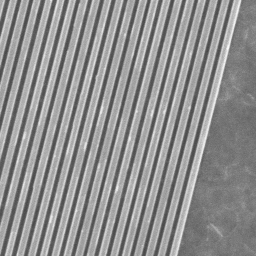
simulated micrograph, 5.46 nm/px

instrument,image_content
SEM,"parallel lines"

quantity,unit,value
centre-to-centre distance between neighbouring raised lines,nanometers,62.5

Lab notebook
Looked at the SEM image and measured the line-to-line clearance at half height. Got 24.5 nm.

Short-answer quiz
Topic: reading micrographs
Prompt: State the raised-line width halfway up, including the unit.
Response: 34.4 nm